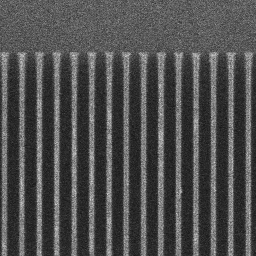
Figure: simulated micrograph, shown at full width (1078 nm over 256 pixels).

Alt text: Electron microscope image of parallel lines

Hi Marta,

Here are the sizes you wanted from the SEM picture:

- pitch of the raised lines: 73.5 nanometres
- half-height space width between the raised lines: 10.5 pixels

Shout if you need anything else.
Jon